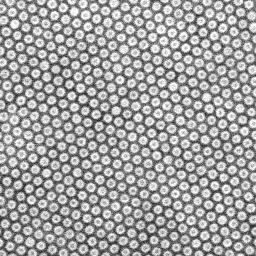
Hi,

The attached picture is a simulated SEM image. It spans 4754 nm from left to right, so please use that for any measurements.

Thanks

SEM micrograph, a regular array of raised bodies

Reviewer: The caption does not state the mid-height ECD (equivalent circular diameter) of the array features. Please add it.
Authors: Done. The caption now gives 136 nanometres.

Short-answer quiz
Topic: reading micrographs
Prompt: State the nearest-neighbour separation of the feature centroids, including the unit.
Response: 212 nm